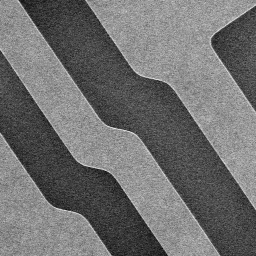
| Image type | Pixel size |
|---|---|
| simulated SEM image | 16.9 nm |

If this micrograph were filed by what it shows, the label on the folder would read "groups of lines, slits or small figures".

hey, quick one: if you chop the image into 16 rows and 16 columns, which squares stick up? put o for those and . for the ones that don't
o.....oooooooooo
oo....oooooooo..
ooo....oooooo...
oooo....oooooo..
.ooo.....ooooo..
..ooo......oooo.
..oooo.....ooooo
...ooo......oooo
....ooooo....ooo
o...ooooo.....oo
oo....oooo....oo
oo.....oooo....o
ooo.....ooo.....
ooooo....ooo....
oooooo....ooo...
ooooooo...ooo...